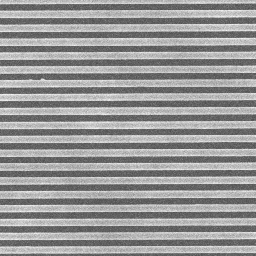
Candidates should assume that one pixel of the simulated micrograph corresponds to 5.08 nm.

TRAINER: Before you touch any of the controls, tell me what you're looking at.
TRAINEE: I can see parallel lines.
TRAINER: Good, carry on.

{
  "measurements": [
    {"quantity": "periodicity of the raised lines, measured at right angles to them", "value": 0.0704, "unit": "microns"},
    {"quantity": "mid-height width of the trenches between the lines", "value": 33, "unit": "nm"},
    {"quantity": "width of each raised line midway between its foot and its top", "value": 0.0375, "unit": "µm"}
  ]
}